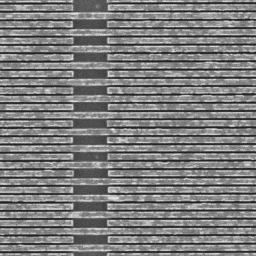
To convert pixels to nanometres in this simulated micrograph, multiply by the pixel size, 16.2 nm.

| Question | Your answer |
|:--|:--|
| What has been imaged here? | parallel lines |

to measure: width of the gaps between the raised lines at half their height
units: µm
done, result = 0.0305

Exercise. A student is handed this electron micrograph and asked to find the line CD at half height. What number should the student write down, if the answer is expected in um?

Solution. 0.102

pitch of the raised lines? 0.135 um